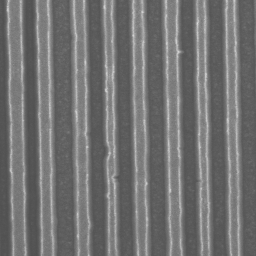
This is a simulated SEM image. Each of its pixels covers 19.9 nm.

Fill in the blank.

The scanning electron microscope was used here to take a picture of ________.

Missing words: parallel lines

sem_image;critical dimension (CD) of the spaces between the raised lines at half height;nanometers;326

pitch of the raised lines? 0.613 um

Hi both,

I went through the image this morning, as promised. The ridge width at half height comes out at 0.288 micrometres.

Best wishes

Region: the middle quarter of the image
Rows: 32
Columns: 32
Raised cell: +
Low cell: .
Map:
..++++....+++....+++.....++++...
...+++....+++....+++.....++++...
..++++....+++....+++.....++++...
..++++....+++....+++.....++++...
..++++....+++....+++.....++++...
..++++....+++....+++.....++++...
..++++....+++....+++.....++++...
..++++....+++....+++.....++++...
..++++....+++....+++.....++++...
..++++....+++....++++....++++...
...+++....+++....++++....++++...
...+++....+++....++++....++++...
...+++....+++....++++....++++...
...+++....+++....++++.....+++...
...+++....+++....++++....++++...
...+++....+++....++++....++++...
...+++....+++....++++....++++...
...+++....+++....++++.....+++...
...+++....+++....++++.....+++...
...+++....+++....++++.....+++...
...+++.....++....++++.....+++...
...+++.....++....++++.....+++...
...+++.....++....++++.....+++...
...+++....+++....++++.....+++...
...+++....+++....++++.....+++...
...+++....+++....++++.....+++...
...+++....+++.....+++.....+++...
...+++.....++.....+++.....+++...
...+++.....++.....+++.....+++...
...+++.....++.....+++.....++++..
...+++.....++.....+++.....++++..
...+++.....++.....+++.....++++..